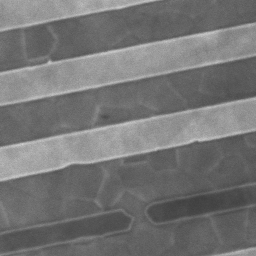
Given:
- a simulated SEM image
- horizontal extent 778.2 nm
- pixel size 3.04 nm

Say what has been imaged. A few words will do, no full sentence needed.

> one or a few lines or trenches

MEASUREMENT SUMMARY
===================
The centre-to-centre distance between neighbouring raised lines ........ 230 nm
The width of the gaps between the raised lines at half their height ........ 126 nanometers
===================